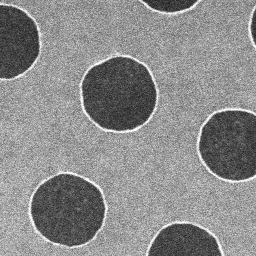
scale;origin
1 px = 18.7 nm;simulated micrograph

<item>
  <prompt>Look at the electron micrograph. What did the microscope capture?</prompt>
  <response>raised bodies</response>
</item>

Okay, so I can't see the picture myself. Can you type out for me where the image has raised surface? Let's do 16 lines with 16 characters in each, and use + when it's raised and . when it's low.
+........+++....
++..............
++..............
++..............
++...++++.......
.....+++++......
.....+++++......
......+++....+++
............++++
............++++
.............+++
...+++..........
..+++++.........
..+++++.........
..++++....+++...
.........+++++..